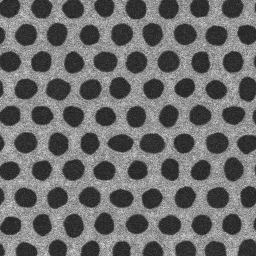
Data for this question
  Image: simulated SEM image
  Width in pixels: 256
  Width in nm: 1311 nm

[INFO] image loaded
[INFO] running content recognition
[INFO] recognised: a regular array of holes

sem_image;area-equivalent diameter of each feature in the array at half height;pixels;21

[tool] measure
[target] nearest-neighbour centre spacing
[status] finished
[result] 158 nm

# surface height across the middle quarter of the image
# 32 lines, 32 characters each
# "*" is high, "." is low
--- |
.....***.....***.....**......***
*...*****...****....****....****
********************************
*************..*****************
.****....***....*****...****....
..**.....**......***.....***....
..**.....**......***.....***....
.***.....**.....****....****....
*****...*****..******..*********
********************************
*.****************.******..*****
....*****...****....****....****
.....***.....***.....***.....**.
.....***.....***....****....***.
....****.....***....****....****
**..******.*****...******..*****
********************************
*****...*************..******..*
.***....****.....**......***....
.***.....**.......*......**.....
.***.....**......**......***....
.****...****....****.....***....
******.*************************
**************************.*****
*...*****..******..******...****
.....***.....***.....***.....***
.....**......***.....***.....***
.....**......***.....***.....***
....****....*****...*****...****
********************************
********************************
*****...*****...*****...****....